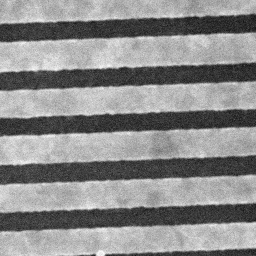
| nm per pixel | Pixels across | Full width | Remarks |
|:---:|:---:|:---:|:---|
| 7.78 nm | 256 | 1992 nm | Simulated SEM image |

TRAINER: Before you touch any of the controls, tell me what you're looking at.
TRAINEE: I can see lines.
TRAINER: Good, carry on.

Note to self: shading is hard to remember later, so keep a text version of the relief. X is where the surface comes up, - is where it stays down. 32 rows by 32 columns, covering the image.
XXXXXXXXXXXXXXXXXXXXXXXXXXXXXXXX
XXXXXXXXXXXXXXXXXXXXXXXXXXXXXXXX
XXXXXXXXXXXX--------------------
--------------------------------
-----------------------XXXXXXXXX
XXXXXXXXXXXXXXXXXXXXXXXXXXXXXXXX
XXXXXXXXXXXXXXXXXXXXXXXXXXXXXXXX
XXXXXXXXXXXXXXXXXXXXXXXXXXXXXXXX
XXXXXXXXXXXXXX------------------
--------------------------------
------------------------XXXXXXXX
XXXXXXXXXXXXXXXXXXXXXXXXXXXXXXXX
XXXXXXXXXXXXXXXXXXXXXXXXXXXXXXXX
XXXXXXXXXXXXXXXXXXXXXXXXXXXXXXXX
XXXXX---------------------------
--------------------------------
------------------XXXXXXXXXXXXXX
XXXXXXXXXXXXXXXXXXXXXXXXXXXXXXXX
XXXXXXXXXXXXXXXXXXXXXXXXXXXXXXXX
XXXXXXXXXXXXXXXXXXXXXXXXXXXX----
XXX-----------------------------
--------------------------------
----------------XXXXXXXXXXXXXXXX
XXXXXXXXXXXXXXXXXXXXXXXXXXXXXXXX
XXXXXXXXXXXXXXXXXXXXXXXXXXXXXXXX
XXXXXXXXXXXXXXXXXXXXXXXXXXXXXX--
--------------------------------
--------------------------------
---------------XXXXXXXXXXXXXXXXX
XXXXXXXXXXXXXXXXXXXXXXXXXXXXXXXX
XXXXXXXXXXXXXXXXXXXXXXXXXXXXXXXX
XXXXXXXXXXXXXXXXXX-X------------